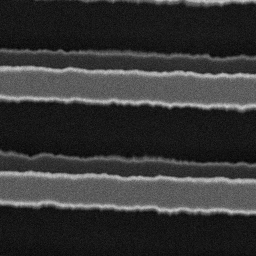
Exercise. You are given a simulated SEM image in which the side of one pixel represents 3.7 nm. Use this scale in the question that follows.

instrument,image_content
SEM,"lines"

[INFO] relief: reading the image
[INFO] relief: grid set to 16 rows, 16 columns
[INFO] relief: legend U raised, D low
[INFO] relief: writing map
DDDDDDDDDDDDDDDD
DDDDDDDDDDDDDDDD
DDDDDDDDDDDDDDDD
UUUUUUUUUUDDDDDD
UUUUUUUUUUUUUUUU
UUUUUUUUUUUUUUUU
DDDDDDDDUUUUUUUU
DDDDDDDDDDDDDDDD
DDDDDDDDDDDDDDDD
DDDDDDDDDDDDDDDD
UUUUUUUUUUUUUUUU
UUUUUUUUUUUUUUUU
UUUUUUUUUUUUUUUU
DDDDDDDDDDDDDDDD
DDDDDDDDDDDDDDDD
DDDDDDDDDDDDDDDD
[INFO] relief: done